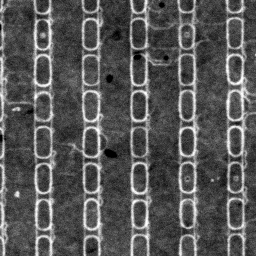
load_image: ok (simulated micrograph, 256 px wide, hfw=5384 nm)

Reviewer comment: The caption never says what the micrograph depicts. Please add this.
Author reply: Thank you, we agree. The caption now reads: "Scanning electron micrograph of wiring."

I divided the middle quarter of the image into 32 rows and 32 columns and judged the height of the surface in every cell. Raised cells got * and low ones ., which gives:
.....****........****........***
.....****........****........***
.....****........****........***
.....****........***.........***
.....****........***.........***
................................
................................
.....****........***.........***
.....****........****........***
.....****........****........***
.....****........****........***
.....****........****........***
.....****........****........***
.....***.........***.........***
................................
................................
.....***.........***.........***
.....****........****........***
.....****........****........***
.....****........****........***
.....****........****........***
.....****........****........***
.....****........***.........***
................................
................................
.....***.........***.........***
.....****........****........***
.....****........****........***
.....****........****........***
.....****........****........***
.....****........****........***
.....****........***.........***